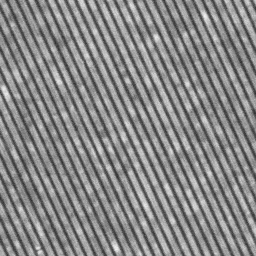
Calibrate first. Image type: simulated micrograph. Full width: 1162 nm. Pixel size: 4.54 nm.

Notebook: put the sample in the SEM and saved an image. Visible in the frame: parallel lines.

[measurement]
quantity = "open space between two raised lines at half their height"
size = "20.1 nanometers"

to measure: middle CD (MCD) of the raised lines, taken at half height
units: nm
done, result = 20.1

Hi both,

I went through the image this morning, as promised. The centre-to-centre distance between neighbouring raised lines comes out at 40.3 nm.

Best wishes